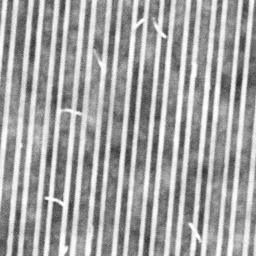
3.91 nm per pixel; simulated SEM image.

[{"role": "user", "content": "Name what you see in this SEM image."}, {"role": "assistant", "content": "parallel lines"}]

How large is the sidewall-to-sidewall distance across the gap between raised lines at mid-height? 38 nanometers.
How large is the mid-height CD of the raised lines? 0.0141 µm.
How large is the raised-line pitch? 51 nm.